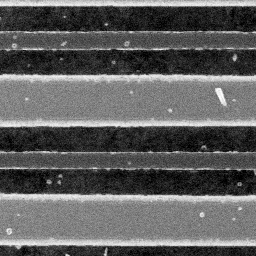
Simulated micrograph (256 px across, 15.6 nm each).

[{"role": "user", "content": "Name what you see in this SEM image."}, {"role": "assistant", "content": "lines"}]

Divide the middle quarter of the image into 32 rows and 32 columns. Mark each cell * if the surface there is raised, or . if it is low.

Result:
................................
................................
................................
********************************
********************************
********************************
********************************
********************************
********************************
********************************
********************************
********************************
********************************
********************************
********************************
................................
................................
................................
................................
................................
................................
................................
********************************
********************************
********************************
********************************
................................
................................
................................
................................
................................
................................